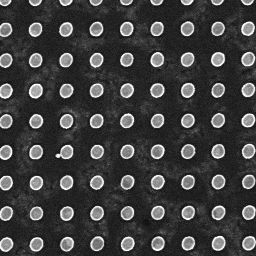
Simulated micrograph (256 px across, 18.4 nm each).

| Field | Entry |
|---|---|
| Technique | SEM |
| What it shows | a regular array of raised bodies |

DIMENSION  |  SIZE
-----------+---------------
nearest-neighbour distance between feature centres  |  555 nm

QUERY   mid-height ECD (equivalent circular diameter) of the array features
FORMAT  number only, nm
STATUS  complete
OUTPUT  241